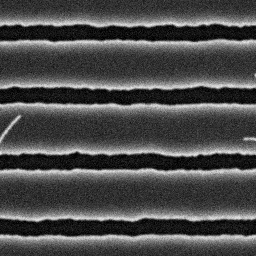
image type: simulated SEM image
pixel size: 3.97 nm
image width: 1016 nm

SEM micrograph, lines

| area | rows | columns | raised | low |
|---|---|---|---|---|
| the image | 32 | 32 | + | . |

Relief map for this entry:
++++++++++++++++++++++++++++++++
++++++++++++++++++++++++++++++++
++++++++++++++++++++++++++++++++
................................
................................
++++++++++++++++++++++++++++++++
++++++++++++++++++++++++++++++++
++++++++++++++++++++++++++++++++
++++++++++++++++++++++++++++++++
++++++++++++++++++++++++++++++++
++++++++++++++++++++++++++++++++
................................
................................
++++++++++++++++++++++++++++++++
++++++++++++++++++++++++++++++++
++++++++++++++++++++++++++++++++
++++++++++++++++++++++++++++++++
++++++++++++++++++++++++++++++++
++++++++++++++++++++++++++++++++
......................++........
................................
++++++++++++++++++++++++++++++++
++++++++++++++++++++++++++++++++
++++++++++++++++++++++++++++++++
++++++++++++++++++++++++++++++++
++++++++++++++++++++++++++++++++
++++++++++++++++++++++++++++++++
...++.......+...+.......+.......
................................
+............++...++.++.....+...
++++++++++++++++++++++++++++++++
++++++++++++++++++++++++++++++++